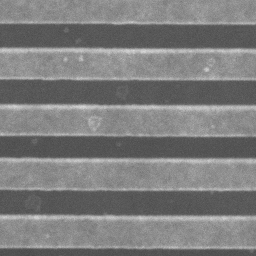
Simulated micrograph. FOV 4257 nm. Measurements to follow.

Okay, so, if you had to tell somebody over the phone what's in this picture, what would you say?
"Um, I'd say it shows lines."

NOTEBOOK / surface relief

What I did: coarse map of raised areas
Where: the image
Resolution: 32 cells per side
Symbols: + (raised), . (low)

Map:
++++++++++++++++++++++++++++++++
++++++++++++++++++++++++++++++++
++++++++++++++++++++++++++++++++
................................
................................
................................
++++++++++++++++++++++++++++++++
++++++++++++++++++++++++++++++++
++++++++++++++++++++++++++++++++
++++++++++++++++++++++++++++++++
................................
................................
................................
++++++++++++++++++++++++++++++++
++++++++++++++++++++++++++++++++
++++++++++++++++++++++++++++++++
++++++++++++++++++++++++++++++++
................................
................................
................................
++++++++++++++++++++++++++++++++
++++++++++++++++++++++++++++++++
++++++++++++++++++++++++++++++++
++++++++++++++++++++++++++++++++
................................
................................
................................
++++++++++++++++++++++++++++++++
++++++++++++++++++++++++++++++++
++++++++++++++++++++++++++++++++
++++++++++++++++++++++++++++++++
................................